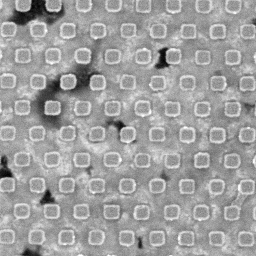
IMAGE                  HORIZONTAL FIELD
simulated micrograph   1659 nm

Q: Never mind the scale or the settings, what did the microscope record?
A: a regular array of raised bodies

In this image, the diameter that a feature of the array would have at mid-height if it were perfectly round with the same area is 99.1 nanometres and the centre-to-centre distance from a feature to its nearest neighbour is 0.191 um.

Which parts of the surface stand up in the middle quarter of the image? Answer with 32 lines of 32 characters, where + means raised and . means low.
................................
................................
................................
+++....+++....++++....+++....+++
+++....+++....++++....+++....+++
+++....+++....++++....+++....+++
................................
................................
................................
...+++.............++...........
...+++....++++....+++.....+++...
...+++....++++....+++.....+++...
...+++.....+++....+++.....+++...
................................
................................
................................
+++....+++....++++....+++....+++
+++....+++....++++....+++....+++
+++...++++....++++....+++....+++
................................
................................
................................
...+++.....++...................
...+++....++++....+++....++++...
...+++....++++....+++....++++...
...+++.....+......+++....++++...
................................
................................
................................
++.....+++....++++....+++....+++
++.....+++....++++....+++....+++
++.....+++....+++.....+++....+++